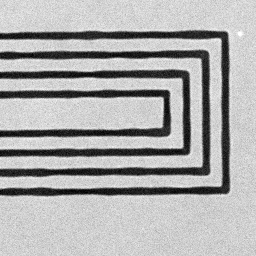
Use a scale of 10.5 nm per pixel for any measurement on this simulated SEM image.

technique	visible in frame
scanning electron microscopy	groups of lines, slits or small figures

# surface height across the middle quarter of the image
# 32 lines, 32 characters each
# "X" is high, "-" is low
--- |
XXXXXXXXXXXXXXXXXXXXXXXXXXXXXXXX
--XXXXXX-----------------------X
-------------------------------X
--------------------------------
XXXXXXXXXXXXXXXXXXXXXXXXXXXXX---
XXXXXXXXXXXXXXXXXXXXXXXXXXXXXX--
---XXXXX------------------XXXX--
---------------------------XXX--
---------------------------XXX--
XXXXXXXXXXXXXXXXXXXXXXXXX--XXX--
XXXXXXXXXXXXXXXXXXXXXXXXX--XXX--
XXXXXXXXXXXXXXXXXXXXXXXXX--XXX--
XXXXXXXXXXXXXXXXXXXXXXXXX--XXX--
XXXXXXXXXXXXXXXXXXXXXXXXX--XXX--
XXXXXXXXXXXXXXXXXXXXXXXXX--XXX--
XXXXXXXXXXXXXXXXXXXXXXXX---XXX--
---------------------------XXX--
---------------------------XXX--
-XXXXXXXXXXXXXXXXXXXXXX-XXXXXX--
XXXXXXXXXXXXXXXXXXXXXXXXXXXXXX--
XXXXXXXXXXXXXXXXXXXXXXXXXXXXXX--
--------------------------------
-------------------------------X
XXXXXXXXXXXXXXXXXXXXXXXXXXXXXXXX
XXXXXXXXXXXXXXXXXXXXXXXXXXXXXXXX
XXXXXXXXXXXXXXXXXXXXXXXXXXXXXXXX
--------------------------------
--------------------------------
XXXXXXXXXXXXXXXXXXXXXXXXXXXXXXXX
XXXXXXXXXXXXXXXXXXXXXXXXXXXXXXXX
XXXXXXXXXXXXXXXXXXXXXXXXXXXXXXXX
--------------------------------